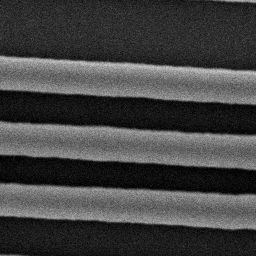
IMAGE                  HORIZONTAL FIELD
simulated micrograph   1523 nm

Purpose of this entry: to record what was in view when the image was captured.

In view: lines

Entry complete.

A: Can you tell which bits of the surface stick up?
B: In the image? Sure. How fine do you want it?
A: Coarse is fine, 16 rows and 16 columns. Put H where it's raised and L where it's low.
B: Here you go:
LLLLLLLLLLLLLLLL
LLLLLLLLLLLLLLLL
LLLLLLLLLLLLLLLL
LLLLLLLLLLLLLLLL
HHHHHHHHHHHHHHHH
HHHHHHHHHHHHHHHH
LLLLLLLLLLLLLLLH
LLLLLLLLLLLLLLLL
HHHHHHHHHHHHHHHL
HHHHHHHHHHHHHHHH
LLLLLLLLLLLLLLLH
LLLLLLLLLLLLLLLL
HHHHHHHHHHHHHHHH
LHHHHHHHHHHHHHHH
LLLLLLLLLLLLLLLL
LLLLLLLLLLLLLLLL